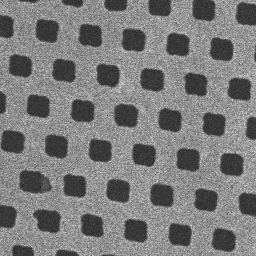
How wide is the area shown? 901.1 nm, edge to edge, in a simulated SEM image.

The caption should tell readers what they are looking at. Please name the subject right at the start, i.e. a regular array of holes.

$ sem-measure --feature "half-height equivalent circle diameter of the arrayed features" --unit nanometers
84.6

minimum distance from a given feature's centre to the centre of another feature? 43.4 px